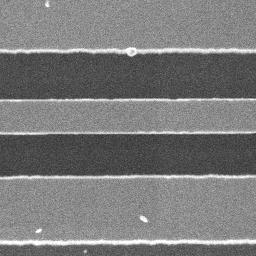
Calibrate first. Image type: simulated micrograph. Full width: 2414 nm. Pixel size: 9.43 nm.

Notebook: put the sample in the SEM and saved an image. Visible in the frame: lines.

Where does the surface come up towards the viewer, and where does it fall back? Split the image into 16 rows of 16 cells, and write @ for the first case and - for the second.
@@@@@@@@@@@@@@@@
@@@@@@@@@@@@@@@@
@@@@@@@@@@@@@@@@
----------------
----------------
----------------
@@@@@@@@@@@@@@@@
@@@@@@@@@@@@@@@@
----------------
----------------
----------------
@@@@@@@@@@@@@@@@
@@@@@@@@@@@@@@@@
@@@@@@@@@@@@@@@@
@@@@@@@@@@@@@@@@
----------------